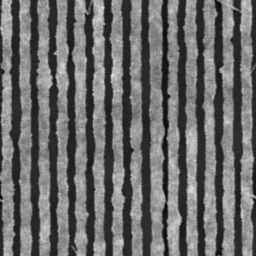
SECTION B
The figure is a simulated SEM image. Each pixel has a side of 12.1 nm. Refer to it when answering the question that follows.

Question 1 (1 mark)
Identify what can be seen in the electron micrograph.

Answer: parallel lines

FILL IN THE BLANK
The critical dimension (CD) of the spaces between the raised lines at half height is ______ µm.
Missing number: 0.104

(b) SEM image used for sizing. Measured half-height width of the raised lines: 0.115 microns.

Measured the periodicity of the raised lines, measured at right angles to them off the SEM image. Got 0.223 µm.